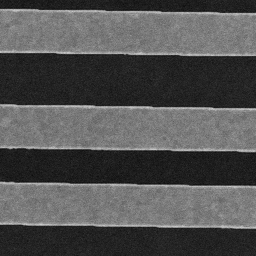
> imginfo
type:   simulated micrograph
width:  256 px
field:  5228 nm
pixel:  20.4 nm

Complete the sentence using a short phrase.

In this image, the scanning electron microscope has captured lines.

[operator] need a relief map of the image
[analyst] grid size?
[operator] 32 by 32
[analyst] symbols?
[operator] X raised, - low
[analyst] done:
--------------------------------
XXXXXXXXXXXXXXXXXXXX------------
XXXXXXXXXXXXXXXXXXXXXXXXXXXXXXXX
XXXXXXXXXXXXXXXXXXXXXXXXXXXXXXXX
XXXXXXXXXXXXXXXXXXXXXXXXXXXXXXXX
XXXXXXXXXXXXXXXXXXXXXXXXXXXXXXXX
XXXXXXXXXXXXXXXXXXXXXXXXXXXXXXXX
--------------------------------
--------------------------------
--------------------------------
--------------------------------
--------------------------------
--------------------------------
XXXXXXXXXXXXXXXXXXXXXXXXXX------
XXXXXXXXXXXXXXXXXXXXXXXXXXXXXXXX
XXXXXXXXXXXXXXXXXXXXXXXXXXXXXXXX
XXXXXXXXXXXXXXXXXXXXXXXXXXXXXXXX
XXXXXXXXXXXXXXXXXXXXXXXXXXXXXXXX
-----XXXXXXXXXXXXXXXXXXXXXXXXXXX
--------------------------------
--------------------------------
--------------------------------
--------------------------------
XXXXXXXXXXXXXXXXXXXXXXXXXXXXXXXX
XXXXXXXXXXXXXXXXXXXXXXXXXXXXXXXX
XXXXXXXXXXXXXXXXXXXXXXXXXXXXXXXX
XXXXXXXXXXXXXXXXXXXXXXXXXXXXXXXX
XXXXXXXXXXXXXXXXXXXXXXXXXXXXXXXX
--------------------------------
--------------------------------
--------------------------------
--------------------------------